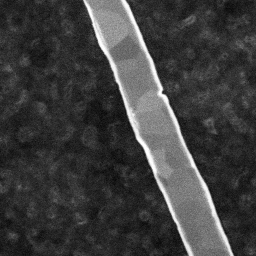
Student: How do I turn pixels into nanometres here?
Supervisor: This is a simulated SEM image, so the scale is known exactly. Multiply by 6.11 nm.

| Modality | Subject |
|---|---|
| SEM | one or a few lines or trenches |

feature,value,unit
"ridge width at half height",0.235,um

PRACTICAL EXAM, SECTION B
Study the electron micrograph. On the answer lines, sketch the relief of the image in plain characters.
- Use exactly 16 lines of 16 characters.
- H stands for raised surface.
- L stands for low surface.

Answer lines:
LLLLLHHHLLLLLLLL
LLLLLLHHLLLLLLLL
LLLLLLHHHLLLLLLL
LLLLLLLHHLLLLLLL
LLLLLLLHHHLLLLLL
LLLLLLLLHHLLLLLL
LLLLLLLLHHLLLLLL
LLLLLLLLHHHLLLLL
LLLLLLLLLHHLLLLL
LLLLLLLLLHHHLLLL
LLLLLLLLLLHHLLLL
LLLLLLLLLLHHHLLL
LLLLLLLLLLHHHLLL
LLLLLLLLLLLHHHLL
LLLLLLLLLLLHHHLL
LLLLLLLLLLLLHHLL